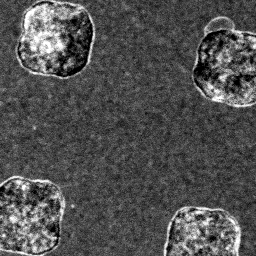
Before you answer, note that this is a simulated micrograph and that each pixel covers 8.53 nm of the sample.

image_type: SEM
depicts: holes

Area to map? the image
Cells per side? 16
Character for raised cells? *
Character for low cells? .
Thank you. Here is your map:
***..***********
**....**********
*.....*******...
*.....******....
**...*******....
************....
**************..
****************
****************
****************
****************
...*************
....************
....*******...**
....*******....*
..********.....*